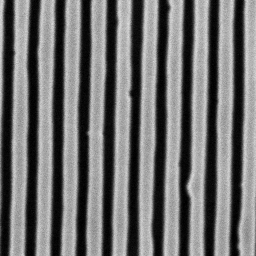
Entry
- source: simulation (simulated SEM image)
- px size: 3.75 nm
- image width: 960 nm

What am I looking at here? parallel lines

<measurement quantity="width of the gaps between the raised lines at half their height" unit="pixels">11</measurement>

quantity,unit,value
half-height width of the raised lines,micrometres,0.0546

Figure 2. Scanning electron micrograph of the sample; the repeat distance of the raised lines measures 96 nm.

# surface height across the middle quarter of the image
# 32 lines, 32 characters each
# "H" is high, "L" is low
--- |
HHHHLLLHHHLLLHHHHLLLHHHLLLHHHLLL
HHHHLLLHHHLLLHHHHLLLHHHLLLHHHLLL
HHHHLLLHHHLLLHHHHLLLHHHLLLHHHLLL
HHHHLLLHHHLLLHHHHLLHHHHLLLHHHLLL
HHHHLLLHHHLLLHHHHLLHHHHLLLHHHLLL
HHHHLLLHHHLLLHHHLLLHHHHLLLHHHLLL
HHHHLLLHHHLLLHHHLLLHHHHLLLHHHLLL
HHHLLLLHHHLLLHHHLLLHHHHLLLHHHLLL
HHHLLLLHHHLLLHHHHLLHHHHLLLHHHLLL
HHHLLLLHHHLLLHHHHLLHHHHLLLHHHLLL
HHHLLLLHHHLLLHHHHLLHHHHLLLHHHLLL
HHHLLLLHHHLLLHHHHLLHHHHLLLHHHLLL
HHHLLLLHHHLLLHHHHLLHHHHLLLHHHLLL
HHHLLLLHHHLLLHHHHLLHHHHLLLHHHLLL
HHHLLLLHHHLLLHHHHLLHHHHLLLHHHLLL
HHHLLLHHHHLLLHHHHLLHHHHLLLHHHLLL
HHHLLLHHHHLLLHHHLLLHHHHLLLHHHLLL
HHHLLLHHHHLLLHHHLLLHHHHLLLHHHLLL
HHHLLLHHHHLLLHHHLLLHHHHLLLHHHLLL
HHHLLLHHHHLLLHHHLLLHHHHLLLHHHLLL
HHHLLLHHHHLLLHHHLLLHHHHLLLHHHLLL
HHHLLLHHHHLLLHHHLLLHHHHLLLHHHLLL
HHHLLLHHHHLLLHHHLLLHHHHLLLHHHLLL
HHHLLLHHHHLLLHHHLLLHHHHLLLHHHLLL
HHHLLLHHHHLLLHHHLLLHHHLLLHHHHLLL
HHHLLLHHHHLLLHHHLLLHHHLLLHHHHLLL
HHHLLLHHHHLLLHHHLLLHHHLLLHHHHLLL
HHHLLLHHHHLLLHHHLLLHHHLLLHHHHLLL
HHHLLLHHHHLLLHHHLLLHHHLLLHHHHLLH
HHHLLLHHHHLLLHHHLLLHHHLLLHHHHLLH
HHHLLLHHHHLLLHHHLLLHHHLLLHHHHLLH
HHHLLLHHHHLLLHHHLLLHHHLLLHHHHLLH